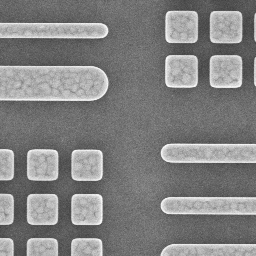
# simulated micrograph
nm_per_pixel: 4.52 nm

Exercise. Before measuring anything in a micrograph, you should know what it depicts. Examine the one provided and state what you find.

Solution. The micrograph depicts groups of lines, slits or small figures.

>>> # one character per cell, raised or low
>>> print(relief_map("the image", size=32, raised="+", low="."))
................................
.....................+++...++...
.....................++++.++++..
+++++++++++++........++++.++++..
+++++++++++++........++++.++++..
................................
................................
.....................++++.++++..
++++++++++++.........++++.++++..
+++++++++++++........++++.++++..
+++++++++++++........+++..++++..
+++++++++++++...................
................................
................................
................................
................................
................................
................................
....................++++++++++++
++.++++..++++.......++++++++++++
++.++++..++++...................
++.++++..++++...................
................................
................................
+...+++..+++....................
++.++++..++++.......++++++++++++
++.++++..++++........+++++++++++
++.++++..++++...................
................................
................................
++.++++..++++...................
++.++++..++++.......++++++++++++